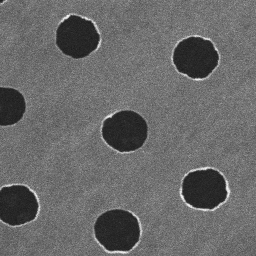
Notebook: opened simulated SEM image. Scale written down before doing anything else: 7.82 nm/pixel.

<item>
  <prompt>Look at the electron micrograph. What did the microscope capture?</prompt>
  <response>holes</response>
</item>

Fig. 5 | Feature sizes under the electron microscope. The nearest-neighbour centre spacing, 0.768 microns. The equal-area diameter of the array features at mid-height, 342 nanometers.